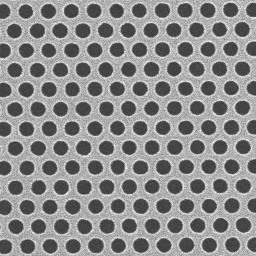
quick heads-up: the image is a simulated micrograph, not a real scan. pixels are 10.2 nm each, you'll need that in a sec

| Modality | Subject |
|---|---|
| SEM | a regular array of holes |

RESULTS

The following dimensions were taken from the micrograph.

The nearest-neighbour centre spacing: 229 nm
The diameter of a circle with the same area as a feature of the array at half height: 15.1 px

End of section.